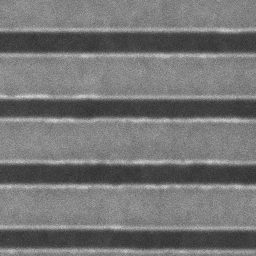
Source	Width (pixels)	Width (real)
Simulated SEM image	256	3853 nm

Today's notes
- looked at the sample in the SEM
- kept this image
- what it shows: lines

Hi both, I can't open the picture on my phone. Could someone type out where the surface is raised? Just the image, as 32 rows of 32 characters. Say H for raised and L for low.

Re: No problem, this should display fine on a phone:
LLLLLLLLLLLLLLLLLLLLLLLLLLLLLLLL
LLLLLLLLLLLLLLLLLLLLLLLLLLLLLLLL
LLLLLLLLLLLLLLLLLLLLLLLLLLLLLLLL
LLLLLLLLLLLLLLLLLLLLLLLLLLLLLLLL
HHHHHHHHHHHHHHHHHHHHHHHHHHHHHHHH
HHHHHHHHHHHHHHHHHHHHHHHHHHHHHHHH
HHHHHHHHHHHHHHHHHHHHHHHHHHHHHHHH
LLLLLLLLLLLLLLLLLLLLLLLLLLLLLLLL
LLLLLLLLLLLLLLLLLLLLLLLLLLLLLLLL
LLLLLLLLLLLLLLLLLLLLLLLLLLLLLLLL
LLLLLLLLLLLLLLLLLLLLLLLLLLLLLLLL
LLLLLLLLLLLLLLLLLLLLLLLLLLLLLLLL
HHHHHHHHHHHHHHHHHHHHHHHHHHHHHHHH
HHHHHHHHHHHHHHHHHHHHHHHHHHHHHHHH
HHHHHHHHHHHHHHHHHHHHHHHHHHHHHHHH
LLLLLLLLLLLLLLLLLLLLLLLLLLLLLLLL
LLLLLLLLLLLLLLLLLLLLLLLLLLLLLLLL
LLLLLLLLLLLLLLLLLLLLLLLLLLLLLLLL
LLLLLLLLLLLLLLLLLLLLLLLLLLLLLLLL
LLLLLLLLLLLLLLLLLLLLLLLLLLLLLLLL
HHHHHHHHHHHHHHHHHHHHHHHHHHHHHHHH
HHHHHHHHHHHHHHHHHHHHHHHHHHHHHHHH
HHHHHHHHHHHHHHHHHHHHHHHHHHHHHHHH
LLLLLLLLLLLLLLLLLLLLLLLLLLLLLLLL
LLLLLLLLLLLLLLLLLLLLLLLLLLLLLLLL
LLLLLLLLLLLLLLLLLLLLLLLLLLLLLLLL
LLLLLLLLLLLLLLLLLLLLLLLLLLLLLLLL
LLLLLLLLLLLLLLLLLLLLLLLLLLLLLLLL
HHHHHHHHHHHHHHHHLLLLLLLLLLLLLLLL
HHHHHHHHHHHHHHHHHHHHHHHHHHHHHHHH
HHHHHHHHHHHHHHHHHHHHHHHHHHHHHHHH
LLLLLLLLLLLLLLLLLLLLLLLLLLLLLLLL